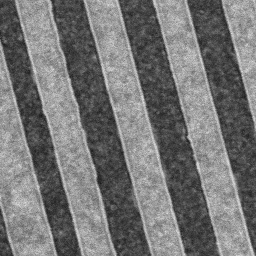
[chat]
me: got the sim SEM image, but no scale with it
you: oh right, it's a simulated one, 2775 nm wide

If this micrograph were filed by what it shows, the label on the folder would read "one or a few lines or trenches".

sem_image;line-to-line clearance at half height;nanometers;385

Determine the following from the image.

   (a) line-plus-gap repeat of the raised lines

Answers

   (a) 66.2 px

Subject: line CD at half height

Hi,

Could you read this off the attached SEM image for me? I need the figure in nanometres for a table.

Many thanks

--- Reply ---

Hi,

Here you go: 333